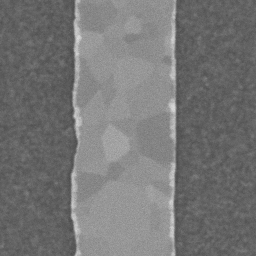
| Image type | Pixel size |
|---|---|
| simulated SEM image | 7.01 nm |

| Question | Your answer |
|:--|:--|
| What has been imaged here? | one or a few lines or trenches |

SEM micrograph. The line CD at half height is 0.703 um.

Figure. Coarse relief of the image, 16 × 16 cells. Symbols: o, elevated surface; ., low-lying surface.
.....oooooo.....
.....oooooo.....
.....oooooo.....
.....oooooo.....
.....oooooo.....
.....oooooo.....
.....oooooo.....
.....oooooo.....
.....oooooo.....
.....oooooo.....
.....oooooo.....
....ooooooo.....
....ooooooo.....
.....oooooo.....
.....oooooo.....
.....oooooo.....